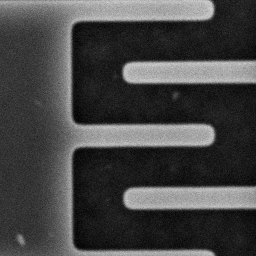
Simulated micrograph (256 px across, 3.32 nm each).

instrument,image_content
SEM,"groups of lines, slits or small figures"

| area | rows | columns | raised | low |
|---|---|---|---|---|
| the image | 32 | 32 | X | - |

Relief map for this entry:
XXXXXXXXXXXXXXXXXXXXXXXXXXX-----
XXXXXXXXXXXXXXXXXXXXXXXXXXX-----
XXXXXXXXXXXXXXXXXXX-------------
XXXXXXXXX-----------------------
XXXXXXXXX-----------------------
XXXXXXXXX-----------------------
XXXXXXXXX-----------------------
XXXXXXXXX-----------------------
XXXXXXXXX-------XXXXXXXXXXXXXXXX
XXXXXXXXX------XXXXXXXXXXXXXXXXX
XXXXXXXXX-----------------------
XXXXXXXXX-----------------------
XXXXXXXXX-----------------------
XXXXXXXXX-----------------------
XXXXXXXXX-----------------------
XXXXXXXXXX----------------------
XXXXXXXXXXXXXXXXXXXXXXXXXXX-----
XXXXXXXXXXXXXXXXXXXXXXXXXXX-----
XXXXXXXXXX----------------------
XXXXXXXXX-----------------------
XXXXXXXXX-----------------------
XXXXXXXXX-----------------------
XXXXXXXXX-----------------------
XXXXXXXXX---------XXXXXXXXXXXXXX
XXXXXXXXX-------XXXXXXXXXXXXXXXX
XXXXXXXXX-------XXXXXXXXXXXXXXXX
XXXXXXXXX-----------------------
XXXXXXXXX-----------------------
XXXXXXXXX-----------------------
XXXXXXXXX-----------------------
XXXXXXXXX-----------------------
XXXXXXXXXXXXXXXXXXXXXXXXXX------